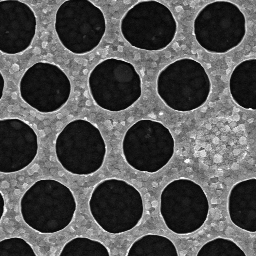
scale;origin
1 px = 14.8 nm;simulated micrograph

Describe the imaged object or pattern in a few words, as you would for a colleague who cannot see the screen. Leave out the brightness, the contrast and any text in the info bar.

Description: a regular array of holes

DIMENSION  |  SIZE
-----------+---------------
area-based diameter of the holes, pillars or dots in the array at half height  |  772 nm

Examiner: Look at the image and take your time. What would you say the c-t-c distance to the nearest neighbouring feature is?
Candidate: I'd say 1010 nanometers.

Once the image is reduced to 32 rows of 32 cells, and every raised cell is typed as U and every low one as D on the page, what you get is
DDDUUUUUDDDDUUUUUDDDUUUUUUDDDUUU
DDDDUUUDDDDDDUUUDDDDDUUUUDDDDDUU
DDDDDUUDDDDDDUUDDDDDDDUUDDDDDDDU
DDDDUUUDDDDDDUUDDDDDDDUUDDDDDDDU
DDDDUUUDDDDDDUUDDDDDDDUUDDDDDDDU
DDDDUUUUDDDDUUUUDDDDDUUUUDDDDDUU
DDUUUUUUUDDUUUUUUUUUUUUUUUUDUUUU
UUUUUUUUUUUUUDDUUUUUUUDDUUUUUUUD
UUUUDDDUUUUUDDDDDUUUUDDDDUUUUDDD
UUUDDDDDUUUDDDDDDUUUDDDDDDUUUDDD
UUDDDDDDDUUDDDDDDDUUDDDDDDUUUDDD
UUUDDDDDDUUDDDDDDDUUDDDDDDUUUDDD
UUUDDDDDUUUUDDDDDUUUDDDDDDUUUDDD
UUUUDDDUUUUUUDDDUUUUUDDDDUUUUUUD
UUUUUUUUUUUUUUUUUUUUUUUUUUUUUUUU
DDDUUUUUUDDUUUUUUDDDUUUUUUUUUUUU
DDDDUUUUDDDDDUUUDDDDDUUUUUUUUUUU
DDDDDUUDDDDDDUUDDDDDDDUUUUUUUUUU
DDDDDUUDDDDDDUUDDDDDDDUUUUUUUUUU
DDDDUUUDDDDDDUUUDDDDDUUUUUUUUUUU
DDDDUUUUDDDDDUUUDDDDDUUUUUUUUUUU
DDUUUUUUUDDDUUUUUUUUUUUUUUUUUUUU
UUUUUDDUUUUUUDDUUUUUUUDDUUUUUUUD
UUUUDDDDUUUUDDDDDUUUUDDDDUUUUDDD
UUUDDDDDDUUDDDDDDDUUDDDDDDUUUDDD
DUUDDDDDDUUDDDDDDDUUDDDDDDUUUDDD
UUUDDDDDDUUDDDDDDDUUDDDDDDUUUDDD
UUUDDDDDDUUUDDDDDUUUUDDDDDUUUDDD
UUUUDDDDUUUUUDDDDUUUUDDDDUUUUUDD
UUUUUUUUUUUUUUUUUUDDUUUUUUUUUUUU
DDDDUUUUDDDDDUUUUDDDDDUUUUDDDUUU
DDDDUUUUDDDDDUUUDDDDDDUUUDDDDDUU